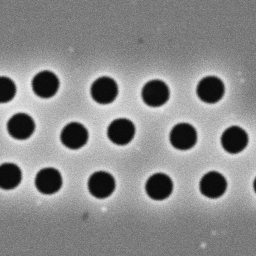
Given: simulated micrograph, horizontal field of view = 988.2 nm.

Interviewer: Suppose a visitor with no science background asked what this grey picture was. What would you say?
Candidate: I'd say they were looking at a regular array of holes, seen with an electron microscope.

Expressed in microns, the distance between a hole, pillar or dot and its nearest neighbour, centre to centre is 0.192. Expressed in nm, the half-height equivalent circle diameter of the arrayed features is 108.